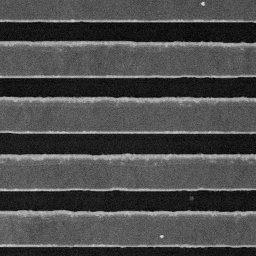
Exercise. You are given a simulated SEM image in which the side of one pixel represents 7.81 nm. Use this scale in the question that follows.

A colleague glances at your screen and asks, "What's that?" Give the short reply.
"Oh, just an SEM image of lines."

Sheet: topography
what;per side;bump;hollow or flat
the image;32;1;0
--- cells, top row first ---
11111111111111111111111111111111
11111111111111111111111111111111
11111111111111111111111111111111
00000000000000000000000000000000
00000000000000000000000000000000
11111111111111111111111111111111
11111111111111111111111111111111
11111111111111111111111111111111
11111111111111111111111111111111
11111111111111111111111111111111
00000000000000000000000000000000
00000000000000000000000000000000
11111111111111111111111111111111
11111111111111111111111111111111
11111111111111111111111111111111
11111111111111111111111111111111
11111111111111111111111111111111
00000000000000000000000000000000
00000000000000000000000000000000
11111111111111111111111111111111
11111111111111111111111111111111
11111111111111111111111111111111
11111111111111111111111111111111
11111111111111111111111111111111
00000000000000000000000000000000
00000000000000000000000000000000
11110011100010011100101111100001
11111111111111111111111111111111
11111111111111111111111111111111
11111111111111111111111111111111
11111111111111111111111111111111
00000000000000000000000000000000